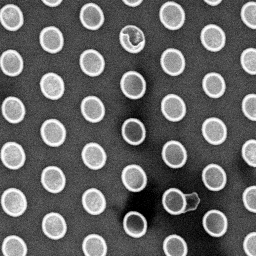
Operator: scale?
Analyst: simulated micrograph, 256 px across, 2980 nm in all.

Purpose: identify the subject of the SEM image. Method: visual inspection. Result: a regular array of raised bodies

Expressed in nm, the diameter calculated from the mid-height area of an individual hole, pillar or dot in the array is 280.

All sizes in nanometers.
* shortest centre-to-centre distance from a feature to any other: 535